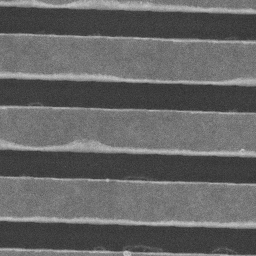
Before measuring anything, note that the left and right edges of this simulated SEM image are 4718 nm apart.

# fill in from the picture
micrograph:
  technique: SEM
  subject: lines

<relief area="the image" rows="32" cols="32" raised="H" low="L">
HHHHHHHHHHHHHHHHHHHHHHHHHHHHHHHH
LLLLLLLLLLLLLLLLLLLLLLLLLLLLHHHH
LLLLLLLLLLLLLLLLLLLLLLLLLLLLLLLL
LLLLLLLLLLLLLLLLLLLLLLLLLLLLLLLL
HHHHHHHHLLLLLLLLLLLLLLLLLLLLLLLL
HHHHHHHHHHHHHHHHHHHHHHHHHHHHHHHH
HHHHHHHHHHHHHHHHHHHHHHHHHHHHHHHH
HHHHHHHHHHHHHHHHHHHHHHHHHHHHHHHH
HHHHHHHHHHHHHHHHHHHHHHHHHHHHHHHH
HHHHHHHHHHHHHHHHHHHHHHHHHHHHHHHH
LLLLLLLLLLLLLLLLLLLLLLLLLLLLLLLL
LLLLLLLLLLLLLLLLLLLLLLLLLLLLLLLL
LLLLLLLLLLLLLLLLLLLLLLLLLLLLLLLL
HHHHHHHHHHLLLLLLLLLLLLLLLLLLLLLL
HHHHHHHHHHHHHHHHHHHHHHHHHHHHHHHH
HHHHHHHHHHHHHHHHHHHHHHHHHHHHHHHH
HHHHHHHHHHHHHHHHHHHHHHHHHHHHHHHH
HHHHHHHHHHHHHHHHHHHHHHHHHHHHHHHH
HHHHHHHHHHHHHHHHHHHHHHHHHHHHHHHH
LLLLLLLLLLLLLLLLLLLLLLLLLLLLLHHH
LLLLLLLLLLLLLLLLLLLLLLLLLLLLLLLL
LLLLLLLLLLLLLLLLLLLLLLLLLLLLLLLL
HHHHHHHHHHHHHHLLLLLLLLLLLLLLLLLL
HHHHHHHHHHHHHHHHHHHHHHHHHHHHHHHH
HHHHHHHHHHHHHHHHHHHHHHHHHHHHHHHH
HHHHHHHHHHHHHHHHHHHHHHHHHHHHHHHH
HHHHHHHHHHHHHHHHHHHHHHHHHHHHHHHH
HHHHHHHHHHHHHHHHHHHHHHHHHHHHHHHH
LLLLLLLLLLLLLLLLLLLLLLLLLLLLLLLL
LLLLLLLLLLLLLLLLLLLLLLLLLLLLLLLL
LLLLLLLLLLLLLLLLLLLLLLLLLLLLLLLL
HHHHHHHHHHHHHHHHHLLLLLLLLLLLLLLL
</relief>